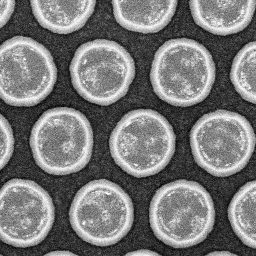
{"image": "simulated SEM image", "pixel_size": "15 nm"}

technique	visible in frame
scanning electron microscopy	raised bodies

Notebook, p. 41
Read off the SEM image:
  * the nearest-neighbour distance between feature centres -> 1200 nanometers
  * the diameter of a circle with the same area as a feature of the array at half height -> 902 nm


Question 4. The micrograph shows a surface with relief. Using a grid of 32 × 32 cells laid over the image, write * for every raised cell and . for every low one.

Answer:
*...*******...********..*******.
*....******....******...*******.
.....*****.....******....******.
.......**........**.......****..
................................
.***........*........***........
******....*****.....******....**
******...*******....******....**
*******..*******...*******...***
*******..*******...********..***
*******...******...*******...***
******....*****.....******....**
.****.......**.......****.......
................................
......****......****......***...
*....******....******....******.
*...*******...*******...*******.
*...*******...********..********
*...*******...*******...*******.
*....******...*******....******.
.....*****.....*****.....*****..
................***........*....
................................
.****......***.......****......*
******....******....******....**
******...*******...*******...***
******...*******...*******...***
******...*******...*******...***
******....******...*******...***
*****......****.....*****.....**
......................*........*
................................